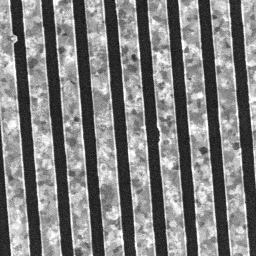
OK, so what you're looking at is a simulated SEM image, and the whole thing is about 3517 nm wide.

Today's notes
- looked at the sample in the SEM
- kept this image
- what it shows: parallel lines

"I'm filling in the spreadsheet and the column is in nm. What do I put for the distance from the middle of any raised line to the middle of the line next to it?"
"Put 429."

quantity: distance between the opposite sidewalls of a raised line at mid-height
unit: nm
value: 247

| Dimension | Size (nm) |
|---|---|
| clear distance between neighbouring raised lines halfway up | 176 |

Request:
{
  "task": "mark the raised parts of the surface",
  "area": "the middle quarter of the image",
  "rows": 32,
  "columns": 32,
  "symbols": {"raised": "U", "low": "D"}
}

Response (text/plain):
UUUDDDDUUUUDDDDUUUUDDDUUUUUDDDUU
UUUDDDDUUUUDDDDUUUUDDDUUUUUDDDUU
UUUDDDDUUUUDDDDUUUUDDDUUUUUDDDUU
UUUDDDDUUUUDDDDUUUUDDDDUUUUDDDUU
UUUDDDDUUUUDDDDUUUUDDDDUUUUDDDDU
UUUUDDDUUUUDDDDUUUUDDDDUUUUDDDDU
UUUUDDDUUUUUDDDUUUUDDDDUUUUDDDDU
UUUUDDDUUUUUDDDUUUUDDDDUUUUDDDDU
UUUUDDDUUUUUDDDUUUUUDDDUUUUDDDDU
UUUUDDDUUUUUDDDUUUUUDDDUUUUDDDDU
UUUUDDDDUUUUDDDUUUUUDDDUUUUUDDDU
UUUUDDDDUUUUDDDDUUUUDDDUUUUUDDDU
UUUUDDDDUUUUDDDDUUUUDDDUUUUUDDDU
UUUUDDDDUUUUDDDDUUUUDDDUUUUUDDDU
UUUUDDDDUUUUDDDDUUUUDDDUUUUUDDDU
UUUUDDDDUUUUDDDDUUUUDDDDUUUUDDDU
UUUUDDDDUUUUDDDDUUUUDDDDUUUUDDDU
UUUUDDDDUUUUDDDDUUUUDDDDUUUUDDDD
UUUUUDDDUUUUDDDDUUUUDDDDUUUUDDDD
UUUUUDDDUUUUUDDDUUUUDDDDUUUUDDDD
UUUUUDDDUUUUUDDDUUUUUDDDUUUUDDDD
DUUUUDDDUUUUUDDDUUUUUDDDUUUUUDDD
DUUUUDDDDUUUUDDDUUUUUDDDUUUUUDDD
DUUUUDDDDUUUUDDDUUUUUDDDUUUUUDDD
DUUUUDDDUUUUUDDDDUUUUDDDUUUUUDDD
DUUUUDDDDUUUUDDDDUUUUDDDUUUUUDDD
DUUUUDDDDUUUUDDDDUUUUDDDUUUUUDDD
DUUUUDDDDUUUUDDDDUUUUDDDUUUUUDDD
DUUUUDDDDUUUUDDDDUUUUDDDDUUUUDDD
DUUUUDDDDUUUUDDDDUUUUDDDDUUUUDDD
DUUUUUDDDUUUUDDDDUUUUDDDDUUUUDDD
DUUUUUDDDUUUUUDDDUUUUDDDDUUUUDDD